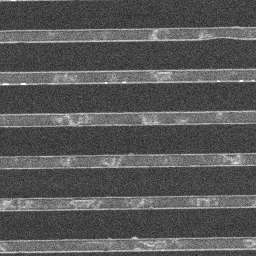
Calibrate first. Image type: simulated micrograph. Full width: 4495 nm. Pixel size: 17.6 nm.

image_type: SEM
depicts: parallel lines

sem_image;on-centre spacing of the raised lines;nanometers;739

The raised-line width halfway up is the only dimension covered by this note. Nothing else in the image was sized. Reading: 529 nm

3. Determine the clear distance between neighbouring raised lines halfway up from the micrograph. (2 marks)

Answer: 208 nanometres